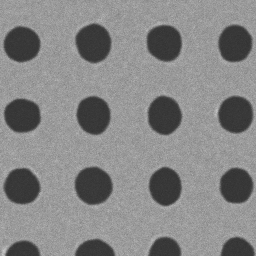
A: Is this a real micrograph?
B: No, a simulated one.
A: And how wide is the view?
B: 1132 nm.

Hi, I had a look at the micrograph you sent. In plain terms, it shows a regular array of holes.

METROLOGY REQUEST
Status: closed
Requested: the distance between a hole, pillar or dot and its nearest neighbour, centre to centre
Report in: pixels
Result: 70.9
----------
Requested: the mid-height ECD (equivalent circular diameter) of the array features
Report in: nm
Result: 158